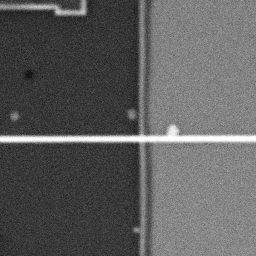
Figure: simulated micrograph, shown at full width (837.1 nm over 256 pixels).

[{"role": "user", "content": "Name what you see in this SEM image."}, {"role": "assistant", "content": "wiring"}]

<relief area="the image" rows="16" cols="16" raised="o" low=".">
oo.oo....ooooooo
.........ooooooo
.........ooooooo
.........ooooooo
.........ooooooo
.........ooooooo
.........ooooooo
.........ooooooo
.........ooooooo
.........ooooooo
.........ooooooo
.........ooooooo
.........ooooooo
.........ooooooo
.........ooooooo
.........ooooooo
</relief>